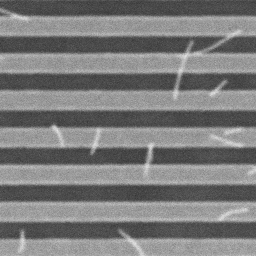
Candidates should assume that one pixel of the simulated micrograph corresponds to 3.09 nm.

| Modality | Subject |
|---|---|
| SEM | wiring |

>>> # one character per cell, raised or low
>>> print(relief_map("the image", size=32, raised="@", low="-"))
--------------------------------
--------------------------------
@@@@@@@@@@@@@@@@@@@@@@@@@@@@@@@@
@@@@@@@@@@@@@@@@@@@@@@@@@@@@@@@@
--------------------------------
--------------------------------
--------------------------------
@@@@@@@@@@@@@@@@@@@@@@@@@@@@@@@@
@@@@@@@@@@@@@@@@@@@@@@@@@@@@@@@@
--------------------------------
--------------------------------
@@@@@@@@@@@@@@@@@@@@@@@@@@@@@@@@
@@@@@@@@@@@@@@@@@@@@@@@@@@@@@@@@
@@@@@@@@@@@@@@@@@@@@@@@@@@@@@@@@
--------------------------------
--------------------------------
@@@@@@@@@@@@@@@@@@@@@@@@@@@@@@@@
@@@@@@@@@@@@@@@@@@@@@@@@@@@@@@@@
------------------@-------------
--------------------------------
--------------------------------
@@@@@@@@@@@@@@@@@@@@@@@@@@@@@@@@
@@@@@@@@@@@@@@@@@@@@@@@@@@@@@@@@
--------------------------------
--------------------------------
@@@@@@@@@@@@@@@@@@@@@@@@@@@@@@@@
@@@@@@@@@@@@@@@@@@@@@@@@@@@@@@@@
@@@@@@@@@@@@@@@@@@@@@@@@@@@@@@@@
--------------------------------
--------------------------------
@@@@@@@@@@@@@@@@@@@@@@@@@@@@@@@@
@@@@@@@@@@@@@@@@@@@@@@@@@@@@@@@@